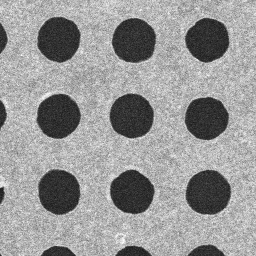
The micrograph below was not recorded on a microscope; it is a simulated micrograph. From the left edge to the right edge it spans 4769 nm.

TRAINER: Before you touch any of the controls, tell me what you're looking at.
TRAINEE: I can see a regular array of holes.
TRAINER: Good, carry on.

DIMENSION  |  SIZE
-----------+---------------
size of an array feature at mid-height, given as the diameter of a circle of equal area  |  819 nanometres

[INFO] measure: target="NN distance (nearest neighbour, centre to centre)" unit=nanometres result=1370